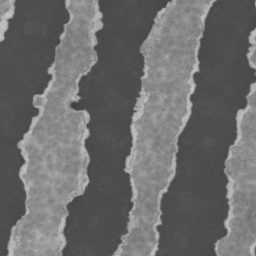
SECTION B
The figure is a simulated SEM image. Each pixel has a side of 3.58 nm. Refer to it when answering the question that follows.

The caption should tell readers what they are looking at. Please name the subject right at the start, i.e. one or a few lines or trenches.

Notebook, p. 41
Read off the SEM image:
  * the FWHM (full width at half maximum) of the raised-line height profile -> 0.162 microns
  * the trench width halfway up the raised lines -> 206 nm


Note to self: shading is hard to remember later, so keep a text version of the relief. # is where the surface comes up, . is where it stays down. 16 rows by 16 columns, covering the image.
#...##....###...
....##....###...
....##...####...
...###...###....
...##....###....
...##....###....
..###....###...#
..###...####...#
..###...###....#
.####...###...##
..###...###...##
..###...###...##
..###...##....##
.###....##....##
.###....##....##
.###...###....##